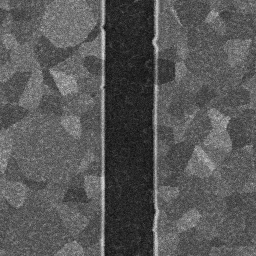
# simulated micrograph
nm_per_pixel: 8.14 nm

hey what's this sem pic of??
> one or a few lines or trenches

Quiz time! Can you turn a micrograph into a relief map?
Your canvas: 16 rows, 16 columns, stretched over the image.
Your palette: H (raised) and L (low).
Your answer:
HHHHHHLLLLHHHHHH
HHHHHHLLLLHHHHHH
HHHHHHLLLLHHHHHH
HHHHHHLLLLHHHHHH
HHHHHHLLLLHHHHHH
HHHHHHLLLLHHHHHH
HHHHHHLLLLHHHHHH
HHHHHHLLLLHHHHHH
HHHHHHLLLLHHHHHH
HHHHHHLLLLHHHHHH
HHHHHHLLLLHHHHHH
HHHHHHLLLLHHHHHH
HHHHHHLLLLHHHHHH
HHHHHHLLLLHHHHHH
HHHHHHLLLLHHHHHH
HHHHHHLLLLHHHHHH